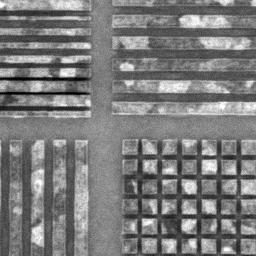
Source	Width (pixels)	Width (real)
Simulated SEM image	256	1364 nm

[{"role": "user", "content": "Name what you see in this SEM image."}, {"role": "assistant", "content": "groups of lines, slits or small figures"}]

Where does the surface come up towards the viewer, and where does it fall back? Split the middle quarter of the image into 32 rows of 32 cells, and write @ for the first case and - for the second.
------------@@@@@@@@@@@@@@@@@@@@
@@@@@@------@@@@@@@@@@@@@@@@@@@@
@@@@@@--------------------------
--------------------------------
@@@@@@------@@@@@@@@@@@@@@@@@@@@
@@@@@@------@@@@@@@@@@@@@@@@@@@@
@@@@@@------@@@@@@@@@@@@@@@@@@@@
--------------------------------
@@@@@@--------------------------
@@@@@@--------------------------
------------@@@@@@@@@@@@@@@@@@@@
------------@@@@@@@@@@@@@@@@@@@@
@@@@@@--------------------------
--------------------------------
--------------------------------
--------------------------------
--------------------------------
--------------------------------
--------------------------------
---@@@---------@@@--@@@--@@@--@@
---@@@---------@@@--@@@--@@@--@@
---@@@---------@@@--@@@--@@@--@@
---@@@-----------@------------@@
---@@@--------------------------
---@@@---------@@@--@@@--@@@--@@
---@@@---------@@@--@@@--@@@--@@
---@@@---------@@@--@@@--@@@--@@
---@@@--------------------------
---@@@--------------------------
---@@@---------@@@--@@@--@@@--@@
---@@@---------@@@--@@@--@@@--@@
---@@@---------@@@--@@@--@@@--@@